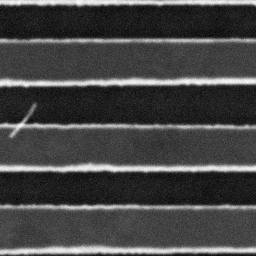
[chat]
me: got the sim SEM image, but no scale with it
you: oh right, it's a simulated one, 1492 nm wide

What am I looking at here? lines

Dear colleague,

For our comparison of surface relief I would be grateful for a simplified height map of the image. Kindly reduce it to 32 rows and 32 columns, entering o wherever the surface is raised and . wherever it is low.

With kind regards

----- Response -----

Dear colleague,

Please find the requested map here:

................................
................................
................................
................................
................................
oooooooooooooooooooooooooooooooo
oooooooooooooooooooooooooooooooo
oooooooooooooooooooooooooooooooo
oooooooooooooooooooooooooooooooo
oooooooooooooooooooooooooooooooo
ooooooooooo.oo.o................
................................
................................
................................
................................
................................
oooooooooooooooooooooooooooooooo
oooooooooooooooooooooooooooooooo
oooooooooooooooooooooooooooooooo
oooooooooooooooooooooooooooooooo
oooooooooooooooooooooooooooooooo
................................
................................
................................
................................
................................
oooooooooooooooooooooooooooooooo
oooooooooooooooooooooooooooooooo
oooooooooooooooooooooooooooooooo
oooooooooooooooooooooooooooooooo
oooooooooooooooooooooooooooooooo
oooooooooooo.oooooooooo.o....oo.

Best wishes